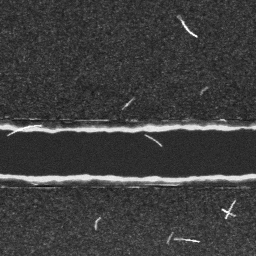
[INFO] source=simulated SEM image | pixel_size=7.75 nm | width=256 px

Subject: one or a few lines or trenches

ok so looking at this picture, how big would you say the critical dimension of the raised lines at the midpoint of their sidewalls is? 387 nm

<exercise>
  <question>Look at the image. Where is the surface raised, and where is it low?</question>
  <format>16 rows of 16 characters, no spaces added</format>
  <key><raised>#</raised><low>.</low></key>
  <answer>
................
................
................
................
................
................
................
................
################
################
################
................
................
................
................
................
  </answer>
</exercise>